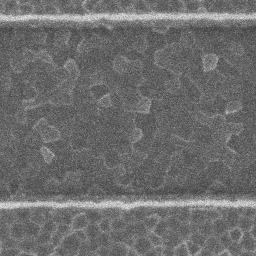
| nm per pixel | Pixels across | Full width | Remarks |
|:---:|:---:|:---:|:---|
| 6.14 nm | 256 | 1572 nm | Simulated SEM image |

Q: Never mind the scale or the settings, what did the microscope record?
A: one or a few lines or trenches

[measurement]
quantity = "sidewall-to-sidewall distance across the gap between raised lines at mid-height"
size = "1.15 µm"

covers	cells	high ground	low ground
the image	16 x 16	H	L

HHHHHHHHHHHHHHHH
LLLLLLLLLLLLLLLL
LLLLLLLLLLLLLLLL
LLLLLLLLLLLLLLLL
LLLLLLLLLLLLLLLL
LLLLLLLLLLLLLLLL
LLLLLLLLLLLLLLLL
LLLLLLLLLLLLLLLL
LLLLLLLLLLLLLLLL
LLLLLLLLLLLLLLLL
LLLLLLLLLLLLLLLL
LLLLLLLLLLLLLLLL
LLLLLLLLLLLLLLLL
HHHHHHHHHHHHHHHH
HHHHHHHHHHHHHHHH
HHHHHHHHHHHHHHHH